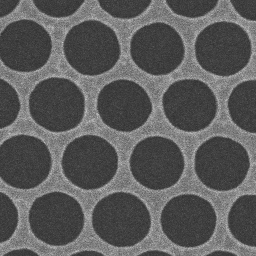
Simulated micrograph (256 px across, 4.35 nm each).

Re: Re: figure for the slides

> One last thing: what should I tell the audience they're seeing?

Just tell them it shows a regular array of holes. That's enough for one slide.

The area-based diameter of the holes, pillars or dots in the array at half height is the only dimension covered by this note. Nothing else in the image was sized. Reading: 0.24 um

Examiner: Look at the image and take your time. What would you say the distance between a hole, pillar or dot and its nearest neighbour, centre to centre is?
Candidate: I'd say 283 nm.